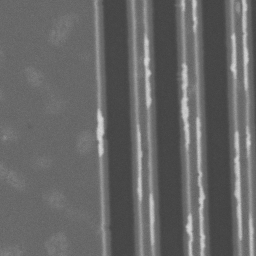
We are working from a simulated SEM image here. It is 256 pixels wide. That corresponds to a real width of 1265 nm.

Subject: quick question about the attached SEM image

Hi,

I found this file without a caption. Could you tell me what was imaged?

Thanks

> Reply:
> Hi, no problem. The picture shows parallel lines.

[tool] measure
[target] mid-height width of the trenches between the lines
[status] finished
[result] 31.6 pixels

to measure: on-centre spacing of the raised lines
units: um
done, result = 0.244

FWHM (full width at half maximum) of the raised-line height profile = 87.7 nm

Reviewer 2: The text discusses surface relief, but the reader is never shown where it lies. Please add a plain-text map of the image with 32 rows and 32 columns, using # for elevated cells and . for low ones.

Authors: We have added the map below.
############....##....###....##.
############....###....##....##.
############....###...###....##.
############....###....##....##.
############....###....##....##.
############.....##....##....##.
#############....##....##....##.
#############....##....##....##.
#############....##....##....##.
#############....##....##....##.
#############....##....##....##.
#############....##....##....##.
#############....##....##....##.
#############....##....##....##.
#############....##....##....##.
#############....##....##....##.
#############....##....##....##.
#############....##....##....##.
#############....##....##....##.
#############....##....##....##.
#############....##....##....##.
#############....##....##....###
#############....##....##....###
#############....##....###...###
#############....##....###...###
#############....##....###....##
#############....##....##.....##
#############....##....###....##
#############....##....###....##
#############....##....###....##
#############....##....###....##
#############....##....###....##